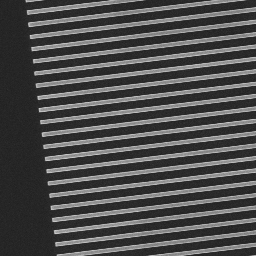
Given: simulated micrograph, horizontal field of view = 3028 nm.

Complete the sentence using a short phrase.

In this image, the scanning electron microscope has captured parallel lines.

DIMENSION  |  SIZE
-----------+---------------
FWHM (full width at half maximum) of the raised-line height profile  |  49.8 nm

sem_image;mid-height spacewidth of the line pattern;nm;99.8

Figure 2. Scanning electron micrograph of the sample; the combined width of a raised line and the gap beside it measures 145 nanometres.